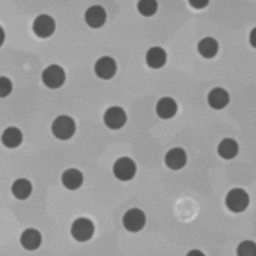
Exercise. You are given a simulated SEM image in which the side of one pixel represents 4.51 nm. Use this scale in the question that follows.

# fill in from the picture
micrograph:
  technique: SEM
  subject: a regular array of holes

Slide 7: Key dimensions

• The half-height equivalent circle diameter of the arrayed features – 105 nm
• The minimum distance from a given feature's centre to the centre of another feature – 51.6 pixels